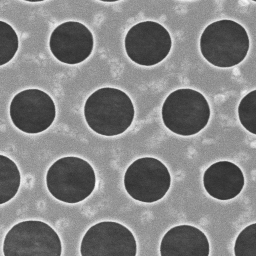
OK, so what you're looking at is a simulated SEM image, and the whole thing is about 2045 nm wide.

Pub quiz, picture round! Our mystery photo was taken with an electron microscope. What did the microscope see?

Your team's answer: a regular array of holes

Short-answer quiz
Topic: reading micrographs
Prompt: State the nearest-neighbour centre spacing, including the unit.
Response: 611 nm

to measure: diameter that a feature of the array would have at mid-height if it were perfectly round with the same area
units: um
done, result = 0.366